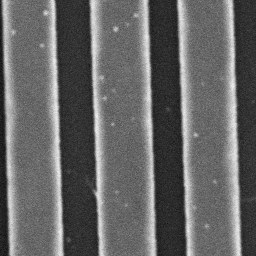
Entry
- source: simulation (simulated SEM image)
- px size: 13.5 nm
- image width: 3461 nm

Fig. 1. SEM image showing lines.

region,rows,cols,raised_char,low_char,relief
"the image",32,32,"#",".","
#######....#######....#######...
#######....#######....#######...
#######....########...#######...
#######....########...#######...
#######....########...#######...
.######....########...#######...
.######....########...#######...
.######.....#######....######...
.######.....#######....######...
.######.....#######....######...
.######.....#######....######...
.######.....#######....######...
.######.....#######....######...
.######.....#######....######...
.######.....#######....#######..
.######.....#######....#######..
.######.....#######....#######..
.######.....#######....#######..
.######.....#######....#######..
.######.....#######....#######..
.######.....#######....#######..
.######.....#######....#######..
.#######....#######....#######..
.#######....#######....#######..
.#######....#######....#######..
.#######....#######....#######..
.#######....#######....#######..
.#######....#######....#######..
.#######....#######....#######..
.#######....#######....#######..
.#######....#######....#######..
.#######....#######....#######..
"